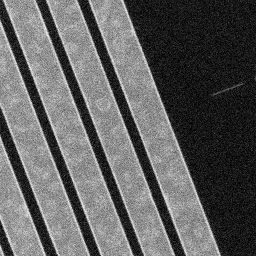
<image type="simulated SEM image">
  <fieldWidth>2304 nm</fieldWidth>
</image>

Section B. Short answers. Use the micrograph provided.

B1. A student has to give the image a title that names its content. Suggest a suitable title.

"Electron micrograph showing parallel lines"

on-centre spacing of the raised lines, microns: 0.363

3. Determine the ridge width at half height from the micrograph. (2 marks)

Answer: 29.9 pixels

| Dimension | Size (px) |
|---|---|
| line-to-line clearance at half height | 10.3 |